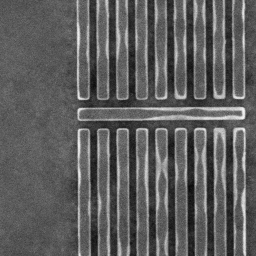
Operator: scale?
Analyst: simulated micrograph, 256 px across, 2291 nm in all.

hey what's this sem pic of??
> groups of lines, slits or small figures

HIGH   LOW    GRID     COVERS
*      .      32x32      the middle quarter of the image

....**..***..***..***..**...**..
....**..***..***..***..**...**..
....**..***..***..***..**...**..
....**..***..***..***..***..***.
....**..***..***..***..***..***.
....**..***..***..***..***..***.
....**...**..***..***..***..**..
....**...**..***..***..***..**..
....**...**...**..***..*........
................................
................................
....****************************
....****************************
....*******************.........
................................
................................
....**...**..***..***..***..***.
....**...**..***..***..***..***.
....**...**..***..***..***..***.
....**...**..***..***..***..***.
....**...**..***..***..***..**..
....**...**..***..***..***..**..
....**...**..***..***..***..***.
....**...**...**..***...**..***.
....**...**...**..***...*...***.
....**...**...**..***...*...***.
....**...**...**..***...*...***.
....**...**...**..***...**..**..
....**...**...**..***..***..**..
....**...**...**..***..***..***.
....**...**...**..***..***..***.
....**...**...**..***..***..***.